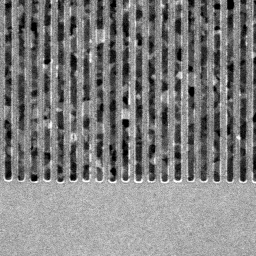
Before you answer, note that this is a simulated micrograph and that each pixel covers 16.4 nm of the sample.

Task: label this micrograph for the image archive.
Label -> parallel lines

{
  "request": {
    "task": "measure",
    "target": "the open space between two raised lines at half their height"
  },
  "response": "87.9 nanometers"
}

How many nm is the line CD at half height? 123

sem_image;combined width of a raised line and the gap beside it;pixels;13.1